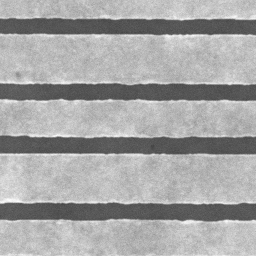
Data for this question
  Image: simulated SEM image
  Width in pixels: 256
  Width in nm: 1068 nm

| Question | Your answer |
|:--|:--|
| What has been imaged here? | lines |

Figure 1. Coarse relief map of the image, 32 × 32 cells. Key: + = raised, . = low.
++++++++++++++++++++++++++++++++
++++++++++++++++++++++++++++++++
................................
................................
++++++++++++++++++++++++++++++++
++++++++++++++++++++++++++++++++
++++++++++++++++++++++++++++++++
++++++++++++++++++++++++++++++++
++++++++++++++++++++++++++++++++
++++++++++++++++++++++++++++++++
................+...........+.+.
................................
+......+.........+..............
++++++++++++++++++++++++++++++++
++++++++++++++++++++++++++++++++
++++++++++++++++++++++++++++++++
++++++++++++++++++++++++++++++++
................................
................................
++++++++++++++++++++++++++++++++
++++++++++++++++++++++++++++++++
++++++++++++++++++++++++++++++++
++++++++++++++++++++++++++++++++
++++++++++++++++++++++++++++++++
++++++++++++++++++++++++++++++++
................................
................................
.......+......++++..............
++++++++++++++++++++++++++++++++
++++++++++++++++++++++++++++++++
++++++++++++++++++++++++++++++++
++++++++++++++++++++++++++++++++